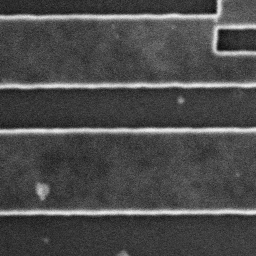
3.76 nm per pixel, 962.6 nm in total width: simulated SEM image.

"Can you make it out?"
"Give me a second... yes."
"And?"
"groups of lines, slits or small figures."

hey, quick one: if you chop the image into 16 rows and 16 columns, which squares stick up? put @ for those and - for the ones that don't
--------------@@
@@@@@@@@@@@@@@@@
@@@@@@@@@@@@@@--
@@@@@@@@@@@@@@@@
@@@@@@@@@@@@@@@@
----------------
----------------
----------------
@@@@@@@@@@@@@@@@
@@@@@@@@@@@@@@@@
@@@@@@@@@@@@@@@@
@@@@@@@@@@@@@@@@
@@@@@@@@@@@@@@@@
----------------
----------------
----------------